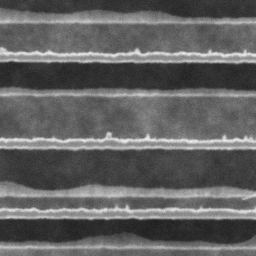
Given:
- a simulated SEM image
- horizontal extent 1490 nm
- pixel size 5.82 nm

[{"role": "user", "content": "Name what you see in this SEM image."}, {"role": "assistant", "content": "lines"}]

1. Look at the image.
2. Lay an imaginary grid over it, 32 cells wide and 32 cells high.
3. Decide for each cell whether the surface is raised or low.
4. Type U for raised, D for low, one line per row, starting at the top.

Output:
DDDDDDDDDDDDDDDDDDDDDDDDDDDDDDDD
DDDDDDDDDDDDDDDDDDDDDDDDDDDDDDDD
UUUUUUUUUUUUUUUDDUUUUDDDDDDDDDDD
UUUUUUUUUUUUUUUUUUUUUUUUUUUUUUUU
UUUUUUUUUUUUUUUUUUUUUUUUUUUUUUUU
UUUUUUUUUUUUUUUUUUUUUUUUUUUUUUUU
UUUUUUUUUUUUUUUUUUUUUUUUUUUUUUUU
UUUUUUUUUUUUUUUUUUUUUUUUUUUUUUUU
DDDDDDDDDDDDDDDDDDDDDDDDDDDDDDDD
DDDDDDDDDDDDDDDDDDDDDDDDDDDDDDDD
DDDDDDDDDDDDDDDDDDDDDDDDDDDDDDDD
DDDDDDDDDDDDDDDDDDDDDDDDDDDDDDDD
UUUUUUUUUUUUUUUUUUUUUUUUUUUUUUUU
UUUUUUUUUUUUUUUUUUUUUUUUUUUUUUUU
UUUUUUUUUUUUUUUUUUUUUUUUUUUUUUUU
UUUUUUUUUUUUUUUUUUUUUUUUUUUUUUUU
UUUUUUUUUUUUUUUUUUUUUUUUUUUUUUUU
UUUUUUUUUUUUUUUUUUUUUUUUUUUUUUUU
DDDDDDDDDUDDDDDDDDDDDDDUUUUUUDDU
DDDDDDDDDDDDDDDDDDDDDDDDDDDDDDDD
DDDDDDDDDDDDDDDDDDDDDDDDDDDDDDDD
DDDDDDDDDDDDDDDDDDDDDDDDDDDDDDDD
DDDDDDDDDDDDDDDDDDDDDDDDDDDDDDDD
DDDDDDDDDDDDDDDDDDDDDDDDDDDDDDDD
UUUUUUUUUUUUUUUUUUUUUUUUUUUUUUUU
UUUUUUUUUUUUUUUUUUUUUUUUUUUUUUUU
UUUUUUUUUUUUUUUUUUUUUUUUUUUUUUUU
DDDDDDDDDDDDDDDDDDDDDDDDDDDDDDDD
DDDDDDDDDDDDDDDDDDDDDDDDDDDDDDDD
DDDDDDDDDDDDDDDDDDDDDDDDDDDDDDDD
DDDDDDDDDDDDDDDDDDDDDDDDDDDDDDDD
UUUUUUUUUUUUUUUUUUUUUUUUUUUUUUUU